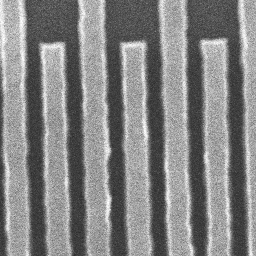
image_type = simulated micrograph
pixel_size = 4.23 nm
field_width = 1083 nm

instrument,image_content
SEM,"parallel lines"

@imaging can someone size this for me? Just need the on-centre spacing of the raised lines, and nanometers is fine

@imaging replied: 170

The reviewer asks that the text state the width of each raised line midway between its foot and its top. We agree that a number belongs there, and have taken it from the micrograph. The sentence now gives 101 nm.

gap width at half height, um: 0.0718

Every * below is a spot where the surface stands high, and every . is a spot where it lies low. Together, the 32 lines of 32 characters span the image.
***.......***.......***.......**
***.......***.......***.......**
***.......***.......***.......**
***.......***.......***.......**
***.......***.......***.......**
***.......***...**..***..***..**
***..***..***..***..***..***..**
***..***..***..***..***...**..**
***..***..***..***..***...**..**
***..***..***..***..***..***..**
***..***..***..***..***..***..**
***..***..***..***..***...**..**
.**..***..***..***..***...**...*
***..***..***...**..***...**...*
***..***..***..***...**...**...*
***...**..***...**...**...**...*
***...**..****..***..**...***..*
***..***..****.****..**...***..*
***..***..****.***...**...***..*
***..***..****..***..***..***..*
.**...**...**...***..***..***..*
.**..****..**...***..***..***..*
.**...***..**...***..***..***..*
.***..***..***..***..***..***..*
.***..***..***..***..***..***..*
.***..***..***..***..***..***..*
.***..***..***..***..***..***..*
.***..***..***..***..***..***..*
.***..***..***..***..***..***..*
.***..***..***..***..***..***..*
.***..***..***..***..***..***..*
.***..***..***..***..***..***..*